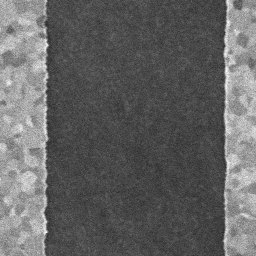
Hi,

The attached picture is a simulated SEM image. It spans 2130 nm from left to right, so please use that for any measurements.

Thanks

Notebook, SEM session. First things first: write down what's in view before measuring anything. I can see one or a few lines or trenches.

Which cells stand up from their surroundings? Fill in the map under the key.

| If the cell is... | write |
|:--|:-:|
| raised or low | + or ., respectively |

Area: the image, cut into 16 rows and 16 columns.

+++...........++
+++...........++
+++...........++
+++...........++
+++...........++
+++...........++
+++...........++
+++...........++
+++...........++
+++...........++
+++...........++
+++...........++
+++...........++
+++...........++
+++...........++
+++...........++